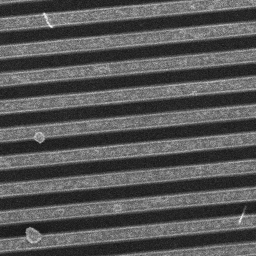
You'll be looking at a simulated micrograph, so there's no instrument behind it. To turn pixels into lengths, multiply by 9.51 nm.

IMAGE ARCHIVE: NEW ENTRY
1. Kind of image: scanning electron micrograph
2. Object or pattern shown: parallel lines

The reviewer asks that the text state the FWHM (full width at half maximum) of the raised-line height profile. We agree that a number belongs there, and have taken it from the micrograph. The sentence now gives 14.4 pixels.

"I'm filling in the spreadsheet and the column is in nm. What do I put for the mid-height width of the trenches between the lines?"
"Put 129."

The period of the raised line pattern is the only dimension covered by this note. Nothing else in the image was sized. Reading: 0.261 um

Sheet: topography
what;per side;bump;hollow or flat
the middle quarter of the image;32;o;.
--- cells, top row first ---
..oooooooooooooooooooooooooooooo
oooooooooooooooooooooooooooo....
ooooooooooooooooo...............
ooooooo.........................
................................
.......................ooooooooo
............oooooooooooooooooooo
...ooooooooooooooooooooooooooooo
oooooooooooooooooooooooooo......
ooooooooooooooo.................
ooooo...........................
................................
......................oooooooooo
...........ooooooooooooooooooooo
.ooooooooooooooooooooooooooooooo
oooooooooooooooooooooooooo......
oooooooooooooooo................
oooooo..........................
................................
....................oooooooooooo
............oooooooooooooooooooo
.ooooooooooooooooooooooooooooooo
ooooooooooooooooooooooooooo.....
oooooooooooooooo................
oooo............................
...............................o
....................oooooooooooo
..........oooooooooooooooooooooo
oooooooooooooooooooooooooooooooo
ooooooooooooooooooooooooo.......
oooooooooooooo..................
oooo............................